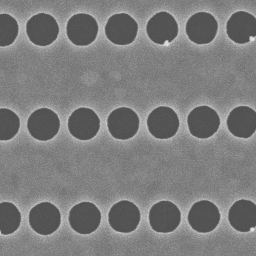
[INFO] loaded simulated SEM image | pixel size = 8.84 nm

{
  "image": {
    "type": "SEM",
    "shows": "a regular array of holes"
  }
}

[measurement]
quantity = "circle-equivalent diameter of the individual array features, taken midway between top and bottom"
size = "287 nanometres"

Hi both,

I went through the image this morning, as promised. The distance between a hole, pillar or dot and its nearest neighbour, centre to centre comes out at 348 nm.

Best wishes